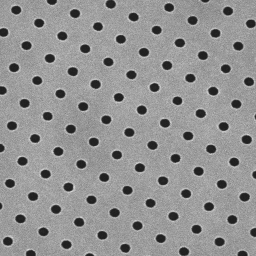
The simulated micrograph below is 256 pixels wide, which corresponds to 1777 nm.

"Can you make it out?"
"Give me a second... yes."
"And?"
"a regular array of holes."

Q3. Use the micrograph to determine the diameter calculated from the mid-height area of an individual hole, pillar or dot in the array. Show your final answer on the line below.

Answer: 0.0641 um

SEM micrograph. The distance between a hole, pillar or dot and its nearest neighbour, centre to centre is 0.177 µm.